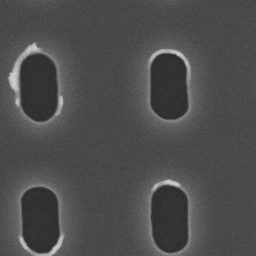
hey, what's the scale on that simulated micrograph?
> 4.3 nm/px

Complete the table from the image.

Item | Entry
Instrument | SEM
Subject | holes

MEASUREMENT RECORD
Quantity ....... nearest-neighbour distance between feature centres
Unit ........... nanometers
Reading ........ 558